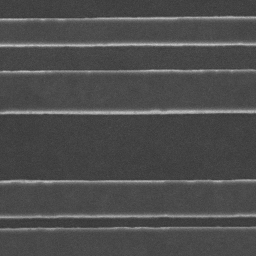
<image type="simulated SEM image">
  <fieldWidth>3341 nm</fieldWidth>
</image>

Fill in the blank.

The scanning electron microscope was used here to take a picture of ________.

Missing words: lines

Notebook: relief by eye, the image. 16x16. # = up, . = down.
................
################
################
################
################
################
################
................
................
................
................
################
################
################
################
################